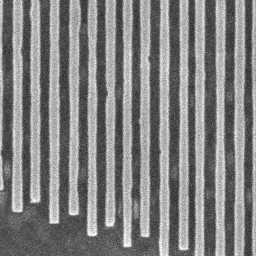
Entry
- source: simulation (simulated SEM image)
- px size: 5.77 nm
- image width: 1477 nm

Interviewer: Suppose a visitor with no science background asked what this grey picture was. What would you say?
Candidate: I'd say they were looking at parallel lines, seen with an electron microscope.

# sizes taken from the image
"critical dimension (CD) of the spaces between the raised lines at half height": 61.3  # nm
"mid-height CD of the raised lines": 46.2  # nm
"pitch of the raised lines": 107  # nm